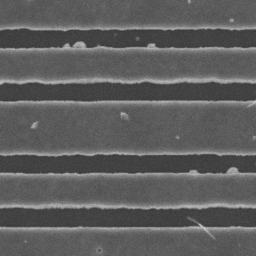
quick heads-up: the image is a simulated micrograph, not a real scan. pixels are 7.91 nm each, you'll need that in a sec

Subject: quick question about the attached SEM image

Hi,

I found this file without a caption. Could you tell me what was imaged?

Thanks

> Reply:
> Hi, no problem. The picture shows lines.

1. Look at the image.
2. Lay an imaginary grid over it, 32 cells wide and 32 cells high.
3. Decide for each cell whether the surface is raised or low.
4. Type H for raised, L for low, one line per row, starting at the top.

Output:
HHHHHHHHHHHHHHHHHHHHHHHHHHHHHHHH
HHHHHHHHHHHHHHHHHHHHHHHHHHHHHHHH
HHHHHHHHHHHHHHHHHHHHHHHHHHHHHHHH
HHLHHHHHHHHHHHHHHHHHHHHHHHHHHHHH
LLLLLLLLLLLLLLLLLLLLLLLLLLLLLLLL
LLLLLLLLLLLLLLLLLLLLLLLLLLLLLLLL
HHHHHHHHHHHHHHHHHHHHHHHHHHHHHHHH
HHHHHHHHHHHHHHHHHHHHHHHHHHHHHHHH
HHHHHHHHHHHHHHHHHHHHHHHHHHHHHHHH
HHHHHHHHHHHHHHHHHHHHHHHHHHHHHHHH
LLLLLLLLLLLLLLLLLLLLLLLLLLLLLLLL
LLLLLLLLLLLLLLLLLLLLLLLLLLLLLLLL
LLLLLLLLLLLLLLLLLLLLLLLLLLLLLLLL
HHHHHHHHHHHHHHHHHHHHHHHHHHHHHHHH
HHHHHHHHHHHHHHHHHHHHHHHHHHHHHHHH
HHHHHHHHHHHHHHHHHHHHHHHHHHHHHHHH
HHHHHHHHHHHHHHHHHHHHHHHHHHHHHHHH
HHHHHHHHHHHHHHHHHHHHHHHHHHHHHHHH
HHHHHHHHHHHHHHHHHHHHHHHHHHHHHHHH
LLLLLLLLLLLLLLLLLLLLLLLLLLLLLLLL
LLLLLLLLLLLLLLLLLLLLLLLLLLLLLLLL
LLLLLLLLLLLLLLLLLLLLLLLLLLLLHHLL
HHHHHHHHHHHHHHHHHHHHHHHHHHHHHHHH
HHHHHHHHHHHHHHHHHHHHHHHHHHHHHHHH
HHHHHHHHHHHHHHHHHHHHHHHHHHHHHHHH
HHHHHHHHHHHHHHHHHHHHHHHHHHHHHHHH
LLLLLLLLLLLLLLLLLLLLLLLLLLLLLLLL
LLLLLLLLLLLLLLLLLLLLLLLLLLLLLLLL
HHHHHHHHHHHHHHHHHHHHHHHHHHHHHHHH
HHHHHHHHHHHHHHHHHHHHHHHHHHHHHHHH
HHHHHHHHHHHHHHHHHHHHHHHHHHHHHHHH
HHHHHHHHHHHHHHHHHHHHHHHHHHHHHHHH